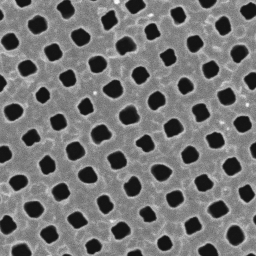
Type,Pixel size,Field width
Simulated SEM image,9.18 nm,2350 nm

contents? a regular array of holes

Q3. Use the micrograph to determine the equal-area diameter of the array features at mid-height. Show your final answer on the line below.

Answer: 154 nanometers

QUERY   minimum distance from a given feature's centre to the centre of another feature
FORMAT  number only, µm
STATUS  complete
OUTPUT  0.279